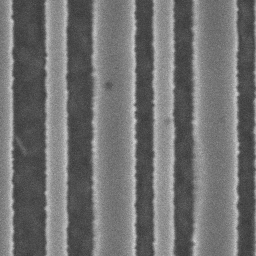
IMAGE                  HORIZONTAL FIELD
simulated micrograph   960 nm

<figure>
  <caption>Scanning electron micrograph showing lines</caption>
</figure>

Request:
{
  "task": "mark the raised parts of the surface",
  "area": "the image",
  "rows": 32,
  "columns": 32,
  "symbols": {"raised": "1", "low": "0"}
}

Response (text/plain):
11000011000011111001110011111100
11000011000011111001110011111100
11000011000011111001110011111100
11000011000011111001110011111100
11000011000011111001110011111100
11000011000011111001110011111100
11000011000011111001110011111100
11000011000111111001110011111100
11000011000011111001110011111100
11000011000011111001110011111100
11000011000011111001110011111100
11000011000011111001110011111100
11000011000011111001110011111100
11000011000011111001110011111100
11000011000011111001110011111100
11000011000011111001110011111100
11000011000011111001110011111100
11000011000011111001110011111100
11000011000011111001110011111100
11000011000011111001110001111100
11000011000011111001110011111100
11000011000011111001110011111100
11000011000011111001110001111100
11000011000011111001110001111100
11000011000011111001110011111100
11000011000011111001110011111100
11000011000011111001110011111100
11000011100011111001110011111100
11000011000011111001110011111100
11000011000011111001110011111100
11000011000011111001110011111100
11000011000011111001110011111100